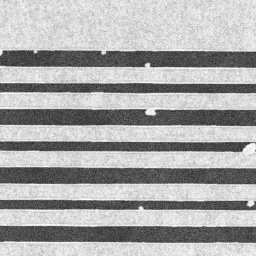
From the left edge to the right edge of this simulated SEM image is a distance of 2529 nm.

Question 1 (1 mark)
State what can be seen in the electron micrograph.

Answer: groups of lines, slits or small figures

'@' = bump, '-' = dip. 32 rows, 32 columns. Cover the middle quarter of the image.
--------------------------------
@@@@@@@@@@@@@@@@@@@@@@@@@@@@@@@@
@@@@@@@@@@@@@@@@@@@@@@@@@@@@@@@@
@@@@@@@@@@@@@@@@@@@@@@@@@@@@@@@@
@@@@@@@@@@@@@@@@@@@@@@@@@@@@@@@@
--------------------------------
--------------------------------
@@@@@@@@@@@@@@------------------
@@@@@@@@@@@@@@@@@@@@@@@@@@@@@@@@
@@@@@@@@@@@@@@@@@@@@@@@@@@@@@@@@
@@@@@@@@@@@@@@@@@@@@@@@@@@@@@@@@
---------------------@@---------
---------------------@@---------
--------------------------------
--------------------------------
--------------------------------
@@@@@@@@@@@@@@@@@@@@@@@@@@@@@@@@
@@@@@@@@@@@@@@@@@@@@@@@@@@@@@@@@
@@@@@@@@@@@@@@@@@@@@@@@@@@@@@@@@
--------------------------------
--------------------------------
--------------------------------
@@@@@@@@@@@@@@@@@@@@@@@@@@@@@@@@
@@@@@@@@@@@@@@@@@@@@@@@@@@@@@@@@
@@@@@@@@@@@@@@@@@@@@@@@@@@@@@@@@
@@@@@@@@@@@@@@@@@@@@@@@@@@@@@@@@
--------------------------------
--------------------------------
--------------------------------
--------------------------------
@@@@@@@@@@@@@@@@@@@@@@@@@@@@@@@@
@@@@@@@@@@@@@@@@@@@@@@@@@@@@@@@@